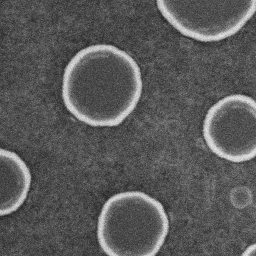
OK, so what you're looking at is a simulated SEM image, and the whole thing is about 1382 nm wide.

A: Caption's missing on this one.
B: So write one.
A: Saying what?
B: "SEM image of raised bodies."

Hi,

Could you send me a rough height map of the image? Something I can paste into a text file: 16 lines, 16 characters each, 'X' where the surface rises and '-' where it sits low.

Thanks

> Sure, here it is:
----------XXXXXX
-----------XXXX-
----------------
-----XXX--------
----XXXXX-------
----XXXXX-------
----XXXX------XX
-----XX------XXX
-------------XXX
--------------XX
XX--------------
XX--------------
X------XX-------
------XXXX------
------XXXX------
-------XXX------